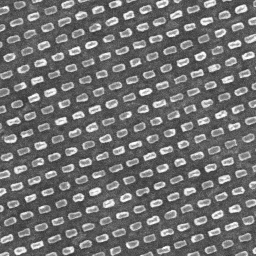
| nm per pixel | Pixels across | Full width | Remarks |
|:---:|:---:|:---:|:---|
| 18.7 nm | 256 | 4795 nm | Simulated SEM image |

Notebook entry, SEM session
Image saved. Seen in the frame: a regular array of raised bodies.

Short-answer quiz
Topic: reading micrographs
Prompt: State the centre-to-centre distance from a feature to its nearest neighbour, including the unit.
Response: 0.327 um